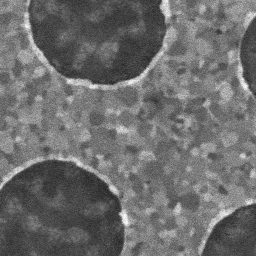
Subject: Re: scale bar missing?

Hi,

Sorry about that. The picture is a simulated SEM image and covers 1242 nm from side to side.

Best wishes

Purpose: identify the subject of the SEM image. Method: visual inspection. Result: holes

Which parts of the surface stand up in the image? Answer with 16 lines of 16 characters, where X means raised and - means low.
XX--------XXXXXX
XX--------XXXXXX
XX--------XXXXX-
XXX-------XXXXX-
XXXX-----XXXXXX-
XXXXXXXXXXXXXXXX
XXXXXXXXXXXXXXXX
XXXXXXXXXXXXXXXX
XXXXXXXXXXXXXXXX
XXXXXXXXXXXXXXXX
XX---XXXXXXXXXXX
-------XXXXXXXXX
-------XXXXXXXXX
--------XXXXXX--
--------XXXXX---
--------XXXXX---